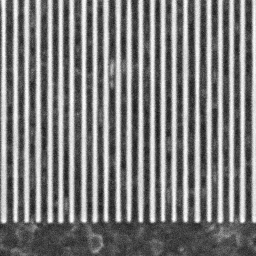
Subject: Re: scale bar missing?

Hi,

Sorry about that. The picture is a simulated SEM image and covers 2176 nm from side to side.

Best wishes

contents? parallel lines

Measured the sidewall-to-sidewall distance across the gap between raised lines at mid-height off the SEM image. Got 0.0669 micrometres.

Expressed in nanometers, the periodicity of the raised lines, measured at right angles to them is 96.9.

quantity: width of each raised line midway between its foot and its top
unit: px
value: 3